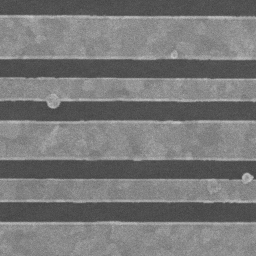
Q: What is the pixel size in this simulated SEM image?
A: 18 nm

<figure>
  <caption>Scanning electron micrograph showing lines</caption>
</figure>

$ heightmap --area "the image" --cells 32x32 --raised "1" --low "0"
00000000000000000000000000000000
00000000000000000000000000000000
11111111111111111111111111111111
11111111111111111111111111111111
11111111111111111111111111111111
11111111111111111111111111111111
11111111111111111111111111111111
00000000000000000000000000000000
00000000000000000000000000000000
00000000000000000000000000000000
11111111111111111111111111111111
11111111111111111111111111111111
00000111000000000000001100000000
00000000000000000000000000000000
00000000000000000000000000000000
11111111111111111111111111111111
11111111111111111111111111111111
11111111111111111111111111111111
11111111111111111111111111111111
11111111111111111111111111111111
00000000000000000000000000000000
00000000000000000000000000000000
11111111111111111111111111110011
11111111111111111111111111111111
11111111111111111111111111111111
00000000000000000000000000000000
00000000000000000000000000000000
00000000000000000000000000000000
11111111111111111111111111111111
11111111111111111111111111111111
11111111111111111111111111111111
11111111111111111111111111111111